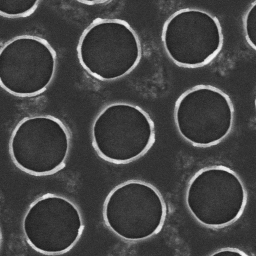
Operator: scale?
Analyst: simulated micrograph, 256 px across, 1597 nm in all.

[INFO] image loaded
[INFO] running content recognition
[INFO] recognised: a regular array of holes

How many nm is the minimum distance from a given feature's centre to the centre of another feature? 501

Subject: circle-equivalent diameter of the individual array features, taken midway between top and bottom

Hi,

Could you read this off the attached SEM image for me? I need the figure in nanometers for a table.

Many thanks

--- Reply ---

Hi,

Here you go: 345